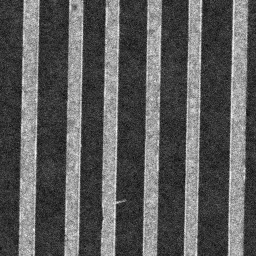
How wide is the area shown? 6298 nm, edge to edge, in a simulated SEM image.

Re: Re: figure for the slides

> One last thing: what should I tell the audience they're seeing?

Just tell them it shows parallel lines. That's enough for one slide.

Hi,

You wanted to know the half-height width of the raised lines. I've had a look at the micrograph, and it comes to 301 nm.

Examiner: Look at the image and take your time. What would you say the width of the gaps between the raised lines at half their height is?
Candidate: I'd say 735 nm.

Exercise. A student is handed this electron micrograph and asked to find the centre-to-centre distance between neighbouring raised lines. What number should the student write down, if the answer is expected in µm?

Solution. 1.03